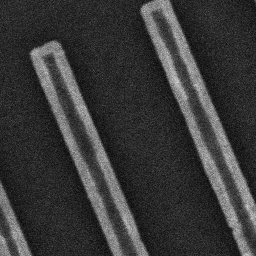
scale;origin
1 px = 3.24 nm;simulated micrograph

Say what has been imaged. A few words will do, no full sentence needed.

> one or a few lines or trenches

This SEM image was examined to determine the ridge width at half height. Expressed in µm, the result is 0.0751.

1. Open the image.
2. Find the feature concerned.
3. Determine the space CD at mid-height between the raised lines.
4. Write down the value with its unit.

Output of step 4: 306 nanometres